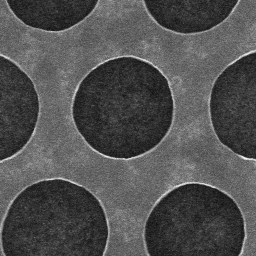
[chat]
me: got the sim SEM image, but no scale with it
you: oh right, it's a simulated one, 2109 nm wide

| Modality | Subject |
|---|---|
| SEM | holes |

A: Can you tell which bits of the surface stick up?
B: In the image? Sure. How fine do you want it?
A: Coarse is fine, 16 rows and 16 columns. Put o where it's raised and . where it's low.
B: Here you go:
o.....ooo......o
oo...ooooo....oo
oooooooooooooooo
ooooooooooooooo.
.ooooo....oooo..
..ooo......oo...
..ooo......oo...
..ooo......oo...
..ooo.....oooo..
.ooooo...oooooo.
oooooooooooooooo
oo...ooooooo.ooo
o.....oooo.....o
.......oo......o
.......oo......o
.......oo......o